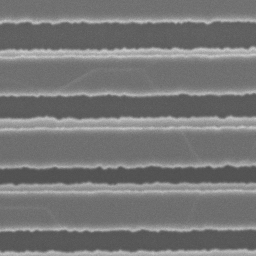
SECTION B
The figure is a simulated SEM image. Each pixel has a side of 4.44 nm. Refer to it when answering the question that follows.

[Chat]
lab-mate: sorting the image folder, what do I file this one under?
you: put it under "lines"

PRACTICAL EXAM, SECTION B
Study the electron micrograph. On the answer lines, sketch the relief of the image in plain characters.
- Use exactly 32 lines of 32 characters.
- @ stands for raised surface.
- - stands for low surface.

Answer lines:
@@@@@@@@@@@@@@@@@@@@@@@@@@@@@@@@
@@@@@@@@@@@@@@@@@@@@@@@@@@@@@@@@
@@@@@@@@@@@@@@@@@@@@@@@@@@@@@@@@
--------------------------------
--------------------------------
--------------------------------
@@@@@@@@@@@@@@@@@@@@@@@@@@@@@@@@
@@@@@@@@@@@@@@@@@@@@@@@@@@@@@@@@
@@@@@@@@@@@@@@@@@@@@@@@@@@@@@@@@
@@@@@@@@@@@@@@@@@@@@@@@@@@@@@@@@
@@@@@@@@@@@@@@@@@@@@@@@@@@@@@@@@
@@@@@@@@@@@@@@@@@@@@@@@@@@@@@@@@
--------------------------------
--------------------------------
--------------------------------
@@@@@@@@@@@@@@@@@@@@@@@@@@@@@@@@
@@@@@@@@@@@@@@@@@@@@@@@@@@@@@@@@
@@@@@@@@@@@@@@@@@@@@@@@@@@@@@@@@
@@@@@@@@@@@@@@@@@@@@@@@@@@@@@@@@
@@@@@@@@@@@@@@@@@@@@@@@@@@@@@@@@
@@@@@@@@@@@@@@@@@@@@@@@@@@@@@@@@
--------------------------------
--------------------------------
@@@@@@@@@@@@@@@@@@@@@@@@@@@@@@@@
@@@@@@@@@@@@@@@@@@@@@@@@@@@@@@@@
@@@@@@@@@@@@@@@@@@@@@@@@@@@@@@@@
@@@@@@@@@@@@@@@@@@@@@@@@@@@@@@@@
@@@@@@@@@@@@@@@@@@@@@@@@@@@@@@@@
@@@@@@@@@@@@@@@@@@@@@@@@@@@@@@@@
--------------------------------
--------------------------------
------@---@-@-@@-@@-@@@@@@@@@@@@